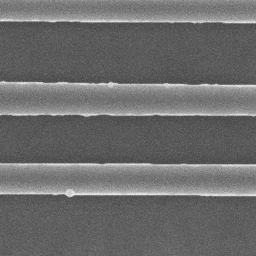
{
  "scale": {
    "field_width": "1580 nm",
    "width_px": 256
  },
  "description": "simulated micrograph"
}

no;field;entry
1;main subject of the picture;lines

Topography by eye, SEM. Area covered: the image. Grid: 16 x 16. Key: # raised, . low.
################
................
................
................
................
################
################
................
................
................
################
################
................
................
................
................